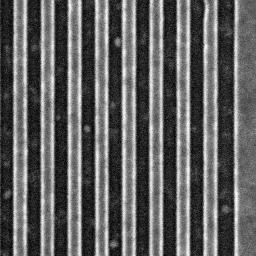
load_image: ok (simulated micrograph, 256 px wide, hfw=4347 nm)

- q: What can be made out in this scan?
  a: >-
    parallel lines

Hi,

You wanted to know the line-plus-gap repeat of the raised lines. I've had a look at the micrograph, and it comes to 462 nm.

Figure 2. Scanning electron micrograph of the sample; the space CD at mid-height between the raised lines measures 267 nanometers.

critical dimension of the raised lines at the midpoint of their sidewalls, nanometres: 189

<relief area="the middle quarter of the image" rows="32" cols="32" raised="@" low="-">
-@@@----@@@----@@@----@@-----@@-
-@@@----@@@----@@@----@@-----@@-
-@@@----@@@----@@@----@@-----@@-
-@@@----@@@----@@@----@@-----@@-
-@@@----@@@----@@@----@@-----@@-
-@@@----@@@----@@@----@@-----@@-
-@@@----@@@----@@@----@@-----@@-
-@@@----@@@----@@@----@@-----@@-
-@@@----@@@----@@@----@@-----@@-
-@@@----@@@----@@@----@@-----@@-
-@@@----@@@----@@@----@@-----@@-
-@@@----@@@----@@@----@@-----@@-
-@@@----@@@----@@@----@@-----@@-
-@@@----@@@----@@@----@@-----@@-
-@@@----@@@----@@@----@@-----@@-
-@@@----@@@----@@@----@@-----@@-
-@@@----@@@----@@@----@@-----@@-
-@@@----@@@----@@@----@@-----@@-
-@@@----@@@----@@@----@@-----@@-
-@@@----@@@----@@@----@@-----@@-
-@@@----@@@----@@@----@@-----@@-
-@@@----@@@----@@@----@@-----@@-
-@@@----@@@----@@@----@@----@@@-
-@@@----@@@----@@@----@@----@@@-
-@@@----@@@----@@@----@@----@@@-
-@@@----@@@----@@@----@@----@@@-
-@@@----@@@----@@@----@@----@@@-
-@@@----@@@----@@@----@@----@@@-
-@@@----@@@----@@@----@@----@@@-
-@@@----@@@----@@@----@@----@@@-
-@@@----@@@----@@@----@@----@@@-
-@@@----@@@----@@@----@@----@@@-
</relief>